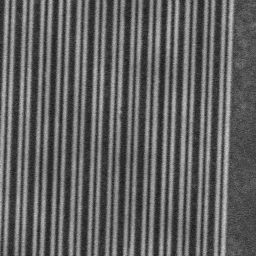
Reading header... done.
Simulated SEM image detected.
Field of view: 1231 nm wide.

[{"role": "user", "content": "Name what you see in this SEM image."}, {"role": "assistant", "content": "parallel lines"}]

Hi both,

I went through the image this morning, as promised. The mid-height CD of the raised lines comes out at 0.018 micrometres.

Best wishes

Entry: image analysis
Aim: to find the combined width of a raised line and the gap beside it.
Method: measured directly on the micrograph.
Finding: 43.4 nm